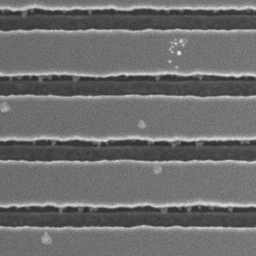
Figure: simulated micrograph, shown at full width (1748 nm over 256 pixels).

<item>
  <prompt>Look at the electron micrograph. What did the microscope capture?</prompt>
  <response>lines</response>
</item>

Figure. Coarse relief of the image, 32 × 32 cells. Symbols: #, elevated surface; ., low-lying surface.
################################
................................
................................
................................
################################
################################
################################
################################
################################
##........####..............####
................................
................................
################################
################################
################################
################################
################################
#####..##.####....###########...
................................
................................
################################
################################
################################
################################
################################
################################
................................
................................
#############################...
################################
################################
################################